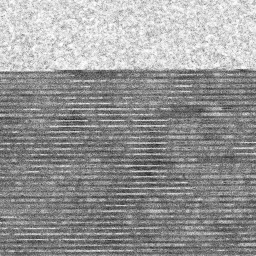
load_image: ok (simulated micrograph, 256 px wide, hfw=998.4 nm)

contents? parallel lines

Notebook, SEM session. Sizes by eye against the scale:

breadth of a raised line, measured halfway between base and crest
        11.7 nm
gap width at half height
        11.7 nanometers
